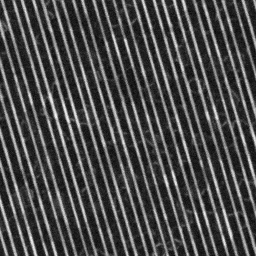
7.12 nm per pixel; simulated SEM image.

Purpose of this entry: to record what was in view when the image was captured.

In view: parallel lines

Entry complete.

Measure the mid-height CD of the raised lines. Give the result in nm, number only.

13.6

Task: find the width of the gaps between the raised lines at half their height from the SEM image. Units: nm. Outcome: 48.8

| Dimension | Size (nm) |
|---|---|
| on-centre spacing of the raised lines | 68.7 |